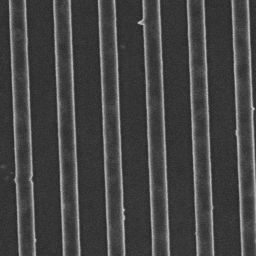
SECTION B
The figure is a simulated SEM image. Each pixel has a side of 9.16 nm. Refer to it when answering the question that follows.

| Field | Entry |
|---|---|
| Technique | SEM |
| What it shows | parallel lines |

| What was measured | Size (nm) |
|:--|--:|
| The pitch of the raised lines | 408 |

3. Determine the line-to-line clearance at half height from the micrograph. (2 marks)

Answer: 260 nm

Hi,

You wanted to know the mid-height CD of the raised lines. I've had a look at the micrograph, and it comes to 151 nm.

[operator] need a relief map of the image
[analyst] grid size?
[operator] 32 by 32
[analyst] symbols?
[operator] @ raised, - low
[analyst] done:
-@@----@@---@@----@@---@@----@@-
-@@----@@---@@----@@----@----@@-
-@@----@@---@@----@@----@@---@@-
-@@----@@---@@----@@----@@---@@-
-@@----@@---@@----@@----@@---@@-
-@@----@@----@@---@@----@@---@@-
-@@----@@----@@---@@----@@---@@-
-@@----@@----@@---@@----@@---@@-
--@----@@----@@---@@----@@---@@-
--@@---@@----@@---@@----@@---@@-
--@@---@@----@@---@@----@@---@@-
--@@---@@----@@---@@----@@----@-
--@@---@@----@@---@@----@@----@-
--@@---@@----@@---@@----@@----@@
--@@---@@----@@----@----@@----@@
--@@---@@----@@----@@---@@----@@
--@@---@@----@@---@@@---@@----@@
--@@---@@----@@----@@---@@----@@
--@@---@@----@@----@@---@@----@@
--@@---@@----@@----@@---@@----@@
--@@----@@---@@----@@---@@----@@
--@@----@@---@@----@@---@@----@@
--@@----@@---@@----@@---@@----@@
--@@----@@---@@----@@---@@----@@
--@@----@@---@@----@@---@@----@@
--@@----@@---@@----@@---@@@---@@
--@@----@@---@@----@@---@@@---@@
--@@----@@---@@----@@----@@---@@
--@@----@@---@@----@@----@@---@@
--@@----@@---@@----@@----@@---@@
--@@----@@----@----@@----@@---@@
--@@----@@----@@---@@----@@---@@